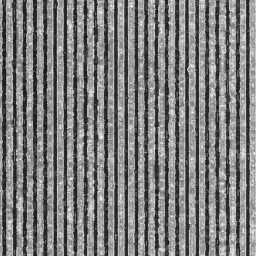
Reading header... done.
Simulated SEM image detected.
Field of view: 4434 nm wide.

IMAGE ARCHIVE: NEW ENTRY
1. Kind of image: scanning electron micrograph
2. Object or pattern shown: parallel lines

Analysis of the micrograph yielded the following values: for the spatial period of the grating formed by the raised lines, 176 nanometers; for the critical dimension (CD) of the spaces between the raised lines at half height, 0.0736 um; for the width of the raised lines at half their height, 104 nm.